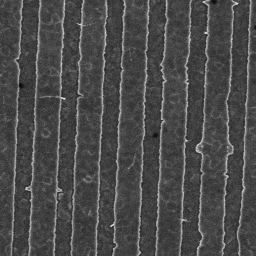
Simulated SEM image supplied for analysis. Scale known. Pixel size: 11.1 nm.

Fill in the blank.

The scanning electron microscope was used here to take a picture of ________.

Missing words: parallel lines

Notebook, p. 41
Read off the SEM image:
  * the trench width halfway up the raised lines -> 16.8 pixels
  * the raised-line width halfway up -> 25.1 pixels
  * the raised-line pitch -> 470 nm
